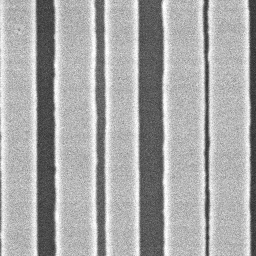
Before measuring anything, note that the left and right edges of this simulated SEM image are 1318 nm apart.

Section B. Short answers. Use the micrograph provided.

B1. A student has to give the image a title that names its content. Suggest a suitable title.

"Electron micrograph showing lines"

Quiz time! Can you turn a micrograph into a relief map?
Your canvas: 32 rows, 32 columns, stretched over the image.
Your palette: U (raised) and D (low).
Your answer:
UUUUDDDUUUUUUUUUUDDDUUUUUUUUUUUD
UUUUDDDUUUUUUUUUUDDDUUUUUUUUUUUD
UUUUDDDUUUUUUUUUUDDDUUUUUUUUUUUD
UUUUDDDUUUUUUUUUUDDDDUUUUUUUUUUD
UUUUDDDUUUUUUUUUUDDDDUUUUUUUUUUD
UUUUDDDUUUUUUUUUUDDDDUUUUUUUUUUD
UUUUDDDUUUUUUUUUUDDDDUUUUUUUUUUD
UUUUDDDUUUUUUUUUUDDDDUUUUUUUUUUD
UUUUDDDUUUUUUUUUUDDDDUUUUUUUUUUD
UUUUDDDUUUUUUUUUUDDDUUUUUUUUUUUD
UUUUUDDUUUUUUUUUUDDDUUUUUUUUUUUD
UUUUUDDUUUUUUUUUUDDDUUUUUUUUUUUD
UUUUUDDUUUUUUUUUUDDDDUUUUUUUUUUD
UUUUUDDUUUUUUUUUUDDDDUUUUUUUUUUD
UUUUUDDUUUUUUUUUUDDDDUUUUUUUUUUD
UUUUUDDUUUUUUUUUUDDDDUUUUUUUUUUD
UUUUUDDUUUUUUUUUUDDDDUUUUUUUUUUD
UUUUUDDUUUUUUUUUUDDDDUUUUUUUUUUD
UUUUUDDUUUUUUUUUUDDDDUUUUUUUUUUD
UUUUUDDUUUUUUUUUUDDDDUUUUUUUUUUD
UUUUUDDUUUUUUUUUUDDDDUUUUUUUUUUD
UUUUUDDUUUUUUUUUUDDDDUUUUUUUUUUD
UUUUUDDUUUUUUUUUUDDDDUUUUUUUUUUD
UUUUUDDUUUUUUUUUUDDDDUUUUUUUUUUD
UUUUUDDUUUUUUUUUUDDDDUUUUUUUUUUD
UUUUUDDUUUUUUUUUUDDDDUUUUUUUUUUD
UUUUUDDUUUUUUUUUUDDDDUUUUUUUUUUD
UUUUUDDUUUUUUUUUUDDDDUUUUUUUUUUD
UUUUUDDUUUUUUUUUUDDDDUUUUUUUUUUD
UUUUUDDUUUUUUUUUUDDDDUUUUUUUUUUD
UUUUUDDUUUUUUUUUUDDDDUUUUUUUUUUD
UUUUUDDUUUUUUUUUUDDDDUUUUUUUUUUD